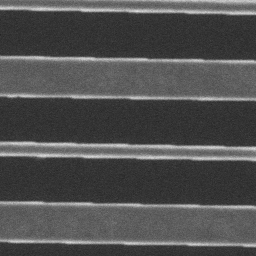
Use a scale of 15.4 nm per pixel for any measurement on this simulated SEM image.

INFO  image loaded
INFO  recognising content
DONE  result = lines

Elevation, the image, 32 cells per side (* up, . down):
********************************
..................**************
................................
................................
................................
................................
................................
**************************......
********************************
********************************
********************************
********************************
................................
................................
................................
................................
................................
................................
********************************
......**************************
................................
................................
................................
................................
................................
************....................
********************************
********************************
********************************
********************************
...............*****************
................................